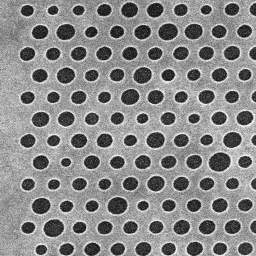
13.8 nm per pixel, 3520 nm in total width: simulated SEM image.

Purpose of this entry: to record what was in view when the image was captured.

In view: a regular array of holes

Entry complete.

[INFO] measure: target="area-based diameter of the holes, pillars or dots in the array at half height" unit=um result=0.199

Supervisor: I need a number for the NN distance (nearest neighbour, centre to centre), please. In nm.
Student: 344